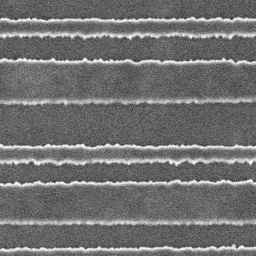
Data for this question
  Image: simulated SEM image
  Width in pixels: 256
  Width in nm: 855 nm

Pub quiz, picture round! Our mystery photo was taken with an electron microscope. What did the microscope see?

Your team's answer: lines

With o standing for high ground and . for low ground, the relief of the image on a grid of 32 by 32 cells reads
................................
................................
o.ooo.oooooooo.ooooooooooooooooo
oooooooooooooooooooooooooooooooo
o.........oo..ooo..o....oo..o...
................................
................................
o.oo..o...o.....................
oooooooooooooooooooooooooooooooo
oooooooooooooooooooooooooooooooo
oooooooooooooooooooooooooooooooo
oooooooooooooooooooooooooooooooo
oooooooooooooooooooooooooooooooo
................................
................................
................................
................................
................................
oooooooooooooooooooooooooooooooo
oooooooooooooooooooooooooooooooo
................................
................................
................................
oooooooooooooooooooooooooooooooo
oooooooooooooooooooooooooooooooo
oooooooooooooooooooooooooooooooo
oooooooooooooooooooooooooooooooo
oooooooooooooooooooooooooooooooo
................................
................................
................................
oooooooooooooooooooooooooooooooo